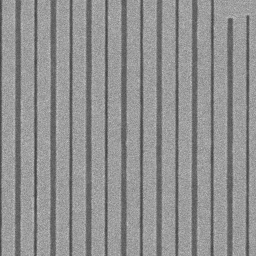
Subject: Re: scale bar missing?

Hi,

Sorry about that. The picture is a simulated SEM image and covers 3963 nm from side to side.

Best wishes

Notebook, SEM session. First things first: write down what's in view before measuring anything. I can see parallel lines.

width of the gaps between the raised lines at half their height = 67.7 nanometers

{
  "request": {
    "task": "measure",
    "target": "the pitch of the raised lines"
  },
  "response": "17.8 pixels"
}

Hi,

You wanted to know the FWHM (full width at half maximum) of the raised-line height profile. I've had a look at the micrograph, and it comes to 0.203 µm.